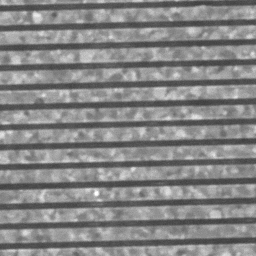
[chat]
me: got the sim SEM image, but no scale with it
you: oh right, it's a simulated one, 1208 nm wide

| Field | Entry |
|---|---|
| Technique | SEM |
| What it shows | parallel lines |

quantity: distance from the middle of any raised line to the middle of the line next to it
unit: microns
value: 0.0937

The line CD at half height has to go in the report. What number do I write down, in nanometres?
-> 61.3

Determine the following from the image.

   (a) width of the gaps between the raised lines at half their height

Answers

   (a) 34.8 nanometres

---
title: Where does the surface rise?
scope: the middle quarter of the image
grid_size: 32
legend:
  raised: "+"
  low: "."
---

................................
.........+++++++++++++++++++++++
++++++++++++++++++++++++++++++++
++++++++++++++++++++++++++++++++
................................
................................
...+++++++++++++++++++++++++++++
++++++++++++++++++++++++++++++++
++++++++++++++++++++++++++++++++
++++............................
................................
++++++++++++++++++++++++++++++++
++++++++++++++++++++++++++++++++
++++++++++++++++++++++++++++++++
................................
................................
..++++++++++++++++++++++++++++++
++++++++++++++++++++++++++++++++
++++++++++++++++++++++++++++++++
.++.............................
................................
++++++++++++++++++++++++++++++++
++++++++++++++++++++++++++++++++
++++++++++++++++++++++++++++++++
................................
................................
.+++++++++++++++++++++++++++++++
++++++++++++++++++++++++++++++++
++++++++++++++++++++++++++++++++
................................
................................
++++++++++++++++++++++++++++++++